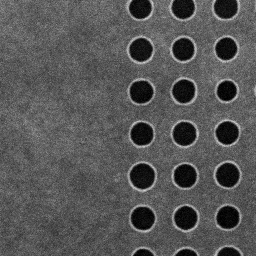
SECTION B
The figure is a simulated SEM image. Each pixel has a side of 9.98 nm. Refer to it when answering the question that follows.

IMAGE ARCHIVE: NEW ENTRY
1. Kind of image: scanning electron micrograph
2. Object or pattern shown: a regular array of holes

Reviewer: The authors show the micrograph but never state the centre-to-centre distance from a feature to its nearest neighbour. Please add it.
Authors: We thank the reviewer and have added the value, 419 nanometers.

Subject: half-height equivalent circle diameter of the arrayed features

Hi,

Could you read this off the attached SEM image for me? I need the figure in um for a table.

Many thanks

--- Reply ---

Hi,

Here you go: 0.248